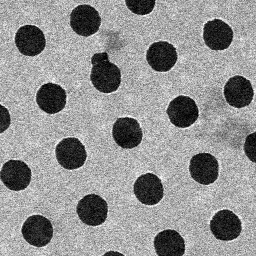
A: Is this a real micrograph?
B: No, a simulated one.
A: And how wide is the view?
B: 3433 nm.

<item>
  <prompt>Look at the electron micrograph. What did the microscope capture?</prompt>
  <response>a regular array of holes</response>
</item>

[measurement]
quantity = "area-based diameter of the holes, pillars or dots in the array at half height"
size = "428 nanometres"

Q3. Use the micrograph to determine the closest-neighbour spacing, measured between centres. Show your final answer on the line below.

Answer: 0.792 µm